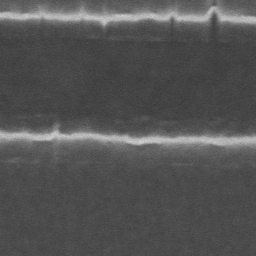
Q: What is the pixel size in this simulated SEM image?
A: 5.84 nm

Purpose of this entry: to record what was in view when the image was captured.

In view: one or a few lines or trenches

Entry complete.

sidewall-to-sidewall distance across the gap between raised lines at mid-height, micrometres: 0.708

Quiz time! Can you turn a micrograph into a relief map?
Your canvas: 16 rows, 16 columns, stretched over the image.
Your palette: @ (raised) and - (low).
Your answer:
@@@@@@@@@@@@@@@@
----------------
----------------
----------------
----------------
----------------
----------------
----------------
---@-@----------
@@@@@@@@@@@@@@@@
@@@@@@@@@@@@@@@@
@@@@@@@@@@@@@@@@
@@@@@@@@@@@@@@@@
@@@@@@@@@@@@@@@@
@@@@@@@@@@@@@@@@
@@@@@@@@@@@@@@@@